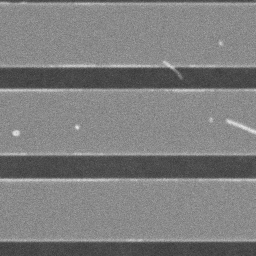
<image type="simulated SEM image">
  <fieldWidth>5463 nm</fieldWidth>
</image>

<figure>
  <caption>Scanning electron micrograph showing lines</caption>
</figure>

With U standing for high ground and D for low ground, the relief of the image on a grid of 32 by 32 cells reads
UUUUUUUUUUUUUUUUUUUUUUUUUUUUUUUU
UUUUUUUUUUUUUUUUUUUUUUUUUUUUUUUU
UUUUUUUUUUUUUUUUUUUUUUUUUUUUUUUU
UUUUUUUUUUUUUUUUUUUUUUUUUUUUUUUU
UUUUUUUUUUUUUUUUUUUUUUUUUUUUUUUU
UUUUUUUUUUUUUUUUUUUUUUUUUUUUUUUU
UUUUUUUUUUUUUUUUUUUUUUUUUUUUUUUU
UUUUUUUUUUUUUUUUUUUUUUUUUUUUUUUU
DDDDDDDDDDDDDDDDDDDDDDDDDDDDDDDD
DDDDDDDDDDDDDDDDDDDDDDDDDDDDDDDD
DDDDDDDDDDDDDDDDDDDDDDDDDDDDDDDD
UUUUUUUUUUUUUUUUUUUUUUUUUUUUUUUU
UUUUUUUUUUUUUUUUUUUUUUUUUUUUUUUU
UUUUUUUUUUUUUUUUUUUUUUUUUUUUUUUU
UUUUUUUUUUUUUUUUUUUUUUUUUUUUUUUU
UUUUUUUUUUUUUUUUUUUUUUUUUUUUUUUU
UUUUUUUUUUUUUUUUUUUUUUUUUUUUUUUU
UUUUUUUUUUUUUUUUUUUUUUUUUUUUUUUU
UUUUUUUUUUUUUUUUUUUUUUUUUUUUUUUU
DDDDDDDDDDDDDDDDDDDDDDDDDDDDDDDD
DDDDDDDDDDDDDDDDDDDDDDDDDDDDDDDD
DDDDDDDDDDDDDDDDDDDDDDDDDDDDDDDD
UUUUUUUUUUUUUUUUUUUUUUUUUUUUUUUU
UUUUUUUUUUUUUUUUUUUUUUUUUUUUUUUU
UUUUUUUUUUUUUUUUUUUUUUUUUUUUUUUU
UUUUUUUUUUUUUUUUUUUUUUUUUUUUUUUU
UUUUUUUUUUUUUUUUUUUUUUUUUUUUUUUU
UUUUUUUUUUUUUUUUUUUUUUUUUUUUUUUU
UUUUUUUUUUUUUUUUUUUUUUUUUUUUUUUU
UUUUUUUUUUUUUUUUUUUUUUUUUUUUUUUU
DDDDDDDDDDDDDDDDDDDDDDDDDDDDDDDD
DDDDDDDDDDDDDDDDDDDDDDDDDDDDDDDD